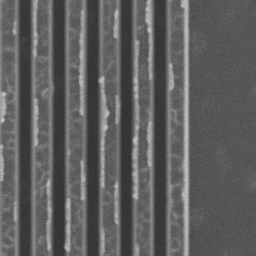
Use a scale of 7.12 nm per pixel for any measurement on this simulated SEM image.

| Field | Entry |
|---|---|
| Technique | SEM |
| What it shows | parallel lines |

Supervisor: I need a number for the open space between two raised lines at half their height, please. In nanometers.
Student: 102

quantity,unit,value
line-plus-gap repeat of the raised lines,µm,0.241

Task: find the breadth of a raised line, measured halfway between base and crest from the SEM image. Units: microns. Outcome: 0.143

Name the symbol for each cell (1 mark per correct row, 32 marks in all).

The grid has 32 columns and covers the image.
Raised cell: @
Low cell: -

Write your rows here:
@@--@@--@@@--@@--@@--@@---------
@@--@@--@@@--@@--@@--@@---------
@@--@@--@@@--@@--@@--@@---------
@@--@@--@@@--@@--@@--@@---------
@@--@@--@@@--@@--@@--@@---------
@@--@@--@@@--@@--@@--@@---------
@@--@@--@@@--@@--@@--@@---------
@@--@@--@@@--@@--@@--@@---------
@@--@@--@@@--@@--@@--@@---------
@@--@@--@@@-@@@--@@--@@---------
@@--@@@-@@@-@@@--@@--@@---------
@@--@@@-@@@--@@--@@--@@---------
@@--@@--@@@--@@--@@--@@---------
@@--@@--@@@--@@--@@--@@---------
@@--@@--@@@--@@--@@--@@---------
@@--@@--@@@--@@--@@--@@---------
@@--@@--@@@--@@--@@--@@---------
@@--@@--@@@--@@--@@--@@---------
@@--@@--@@@--@@--@@--@@---------
@@--@@--@@@--@@--@@--@@---------
@@--@@--@@@-@@@--@@--@@---------
@@--@@--@@@-@@@--@@--@@---------
@@--@@--@@@-@@@--@@--@@---------
@@--@@--@@@-@@@--@@--@@---------
@@--@@--@@@-@@@--@@--@@---------
@@--@@--@@@-@@@--@@--@@---------
@@--@@--@@@-@@@--@@--@@---------
@@--@@--@@@-@@@--@@--@@---------
@@--@@--@@@-@@@--@@--@@---------
@@--@@--@@@-@@@--@@--@@---------
@@--@@--@@@-@@@--@@--@@---------
@@--@@--@@@-@@@--@@--@@---------